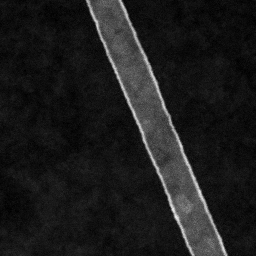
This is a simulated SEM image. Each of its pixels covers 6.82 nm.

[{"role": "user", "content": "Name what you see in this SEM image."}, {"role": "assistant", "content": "one or a few lines or trenches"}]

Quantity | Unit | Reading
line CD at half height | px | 31.1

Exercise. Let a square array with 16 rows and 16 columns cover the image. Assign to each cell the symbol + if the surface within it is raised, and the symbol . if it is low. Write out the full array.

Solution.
......++........
......++........
......+++.......
.......++.......
.......++.......
........++......
........++......
.........++.....
.........++.....
.........++.....
..........++....
..........++....
...........++...
...........++...
...........+++..
............++..